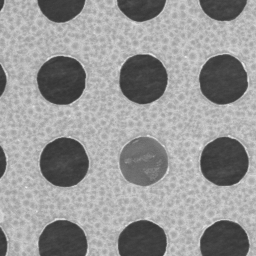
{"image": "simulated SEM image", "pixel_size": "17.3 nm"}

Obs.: holes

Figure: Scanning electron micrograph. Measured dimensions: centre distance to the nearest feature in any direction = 80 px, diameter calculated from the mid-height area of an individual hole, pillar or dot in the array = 856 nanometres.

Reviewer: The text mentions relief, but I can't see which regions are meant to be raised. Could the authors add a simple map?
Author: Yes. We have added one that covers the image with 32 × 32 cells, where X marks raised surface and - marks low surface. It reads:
XXXXX------XXXX------XXXX------X
XXXXX-----XXXXX-----XXXXXX----XX
XXXXXX---XXXXXXXX--XXXXXXXX--XXX
XXXXXXXXXXXXXXXXXXXXXXXXXXXXXXXX
XXXXXXXXXXXXXXXXXXXXXXXXXXXXXXXX
XXXXXXXXXXXXXXXXXXXXXXXXXXXXXXXX
XXXXXXXXXXXXXXXXXXXXXXXXXXXXXXXX
XXXXXX----XXXXXX----XXXXXX----XX
XXXXX-----XXXXX------XXXX------X
-XXXX------XXXX------XXXX------X
-XXXX------XXXX------XXXX------X
XXXXX-----XXXXX------XXXX------X
XXXXXX----XXXXXX----XXXXXX----XX
XXXXXXXXXXXXXXXXXXXXXXXXXXXXXXXX
XXXXXXXXXXXXXXXXXXXXXXXXXXXXXXXX
XXXXXXXXXXXXXXXXXXXXXXXXXXXXXXXX
XXXXXXXXXXXXXXXXXXXXXXXXXXXXXXXX
XXXXXXX--XXXXXXXX--XXXXXXXX---XX
XXXXXX-----XXXX------XXXXX-----X
-XXXX------XXXX------XXXX------X
-XXXX------XXXX------XXXX------X
-XXXX------XXXX------XXXX------X
XXXXXX----XXXXXX----XXXXXX----XX
XXXXXXXXXXXXXXXXXXXXXXXXXXXXXXXX
XXXXXXXXXXXXXXXXXXXXXXXXXXXXXXXX
XXXXXXXXXXXXXXXXXXXXXXXXXXXXXXXX
XXXXXXXXXXXXXXXXXXXXXXXXXXXXXXXX
XXXXXXXXXXXXXXXXXXXXXXXXXXXXXXXX
XXXXXX----XXXXXX----XXXXXX----XX
-XXXX------XXXX------XXXX------X
-XXXX------XXXX------XXXX------X
-XXXX------XXXX------XXXX------X